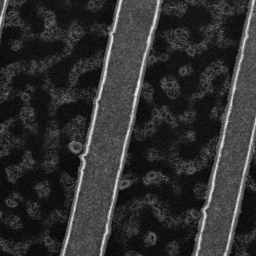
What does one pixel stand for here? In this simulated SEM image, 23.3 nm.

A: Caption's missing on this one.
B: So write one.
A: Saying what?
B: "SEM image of one or a few lines or trenches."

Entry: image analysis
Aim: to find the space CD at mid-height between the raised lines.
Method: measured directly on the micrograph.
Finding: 2200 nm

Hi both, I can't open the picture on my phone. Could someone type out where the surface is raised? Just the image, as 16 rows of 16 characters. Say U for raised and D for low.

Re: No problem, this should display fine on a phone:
DDDDDDDUUUDDDDDD
DDDDDDDUUUDDDDDD
DDDDDDDUUDDDDDDU
DDDDDDDUUDDDDDDU
DDDDDDDUUDDDDDDU
DDDDDDUUUDDDDDDU
DDDDDDUUDDDDDDUU
DDDDDDUUDDDDDDUU
DDDDDDUUDDDDDDUU
DDDDDUUUDDDDDDUU
DDDDDUUUDDDDDDUD
DDDDDUUDDDDDDUUD
DDDDDUUDDDDDDUUD
DDDDDUUDDDDDDUUD
DDDDUUUDDDDDDUDD
DDDDUUDDDDDDUUDD